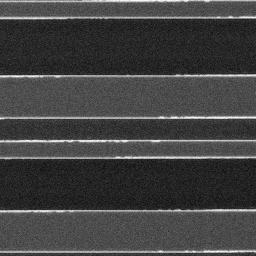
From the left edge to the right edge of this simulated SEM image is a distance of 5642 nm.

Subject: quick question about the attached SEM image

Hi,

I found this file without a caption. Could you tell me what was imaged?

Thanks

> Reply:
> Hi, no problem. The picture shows lines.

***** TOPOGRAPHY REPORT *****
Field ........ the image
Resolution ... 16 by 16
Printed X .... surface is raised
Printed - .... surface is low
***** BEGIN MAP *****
XXXXXXXXXXXXXXXX
----------------
----------------
----------------
----------------
XXXXXXXXXXXXXXXX
XXXXXXXXXXXXXXXX
XXXXXXXXXXXXXXXX
XXXXXXXXXXXXXXXX
XXXXXXXXXXXXXXXX
----------------
----------------
----------------
XXXXXXXXXXXXXXXX
XXXXXXXXXXXXXXXX
XXXXXXXXXXXXXXXX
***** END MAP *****